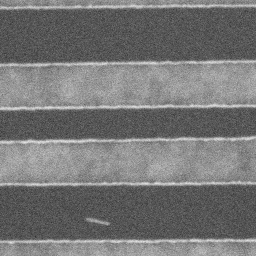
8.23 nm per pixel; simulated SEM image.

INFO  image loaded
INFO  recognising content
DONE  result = lines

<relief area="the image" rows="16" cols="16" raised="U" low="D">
UUUUUUUUUUUUUUUU
UUUUUUUUUUUUUUUU
UUUUUUUUUUUUUUUU
UUUUUUUUUUUUUUUU
DDDDDDDDDDDDDDDD
DDDDDDDDDDDDDDDD
DDDDDDDDDDDDDDDD
UUUUUUUUUUUUUUUU
UUUUUUUUUUUUUUUU
DDDDDDDDDDDDDDDD
DDDDDDDDDDDDDDDD
DDDDDUUUUUUUUUUU
UUUUUUUUUUUUUUUU
UUUUUUUUUUUUUUUU
UUUUUUUUUUUUUUUU
DDDDDDDDDDDDDDDD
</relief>